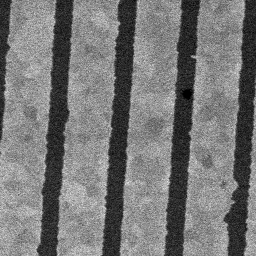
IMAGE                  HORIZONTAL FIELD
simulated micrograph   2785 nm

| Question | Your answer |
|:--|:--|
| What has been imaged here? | one or a few lines or trenches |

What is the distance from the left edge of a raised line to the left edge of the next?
683 nm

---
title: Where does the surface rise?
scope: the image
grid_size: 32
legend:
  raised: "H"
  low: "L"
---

LHHHHHHLLHHHHHHLLHHHHHHLLHHHHHHL
LHHHHHHLLHHHHHHLLHHHHHHLLHHHHHLL
LHHHHHHLLHHHHHHLLHHHHHLLLHHHHHLL
LHHHHHHLLHHHHHHLLHHHHHLLLHHHHHLL
LHHHHHHLLHHHHHHLLHHHHHLLLHHHHHLL
LHHHHHHLLHHHHHLLLHHHHHLLLHHHHHLL
LHHHHHLLLHHHHHLLLHHHHHLLLHHHHHLL
LHHHHHLLLHHHHHLLLHHHHHLLHHHHHHLL
LHHHHHLLLHHHHHLLLHHHHHLLLHHHHHLL
LHHHHHLLLHHHHHLLLHHHHHLLHHHHHHLL
LHHHHHLLLHHHHHLLLHHHHHLLHHHHHHLL
LHHHHHLLLHHHHHLLHHHHHHLLHHHHHHLL
LHHHHHLLLHHHHHLLHHHHHHLLHHHHHHLL
LHHHHHLLLHHHHHLLHHHHHHLLHHHHHHLL
LHHHHHLLLHHHHHLLHHHHHHLLHHHHHHLL
HHHHHHLLHHHHHHLLHHHHHHLLHHHHHLLL
HHHHHHLLHHHHHHLLHHHHHHLLHHHHHLLL
HHHHHHLLHHHHHHLLHHHHHLLLHHHHHLLL
HHHHHHLLHHHHHHLLHHHHHLLLHHHHHLLL
HHHHHHLLHHHHHLLLHHHHHLLLHHHHHLLH
HHHHHHLLHHHHHLLLHHHHHLLLHHHHHLLH
HHHHHHLLHHHHHLLLHHHHHLLLHHHHHLLH
HHHHHLLLHHHHHLLLHHHHHLLLHHHHHLLH
HHHHHLLLHHHHHLLLHHHHHLLHHHHHHLLH
HHHHHLLLHHHHHLLHHHHHHLLHHHHHHLLH
HHHHHLLLHHHHHLLHHHHHHLLHHHHHHLLH
HHHHHLLHHHHHHLLLHHHHHLLHHHHHLLLH
HHHHHLLHHHHHHLLHHHHHHLLHHHHHLLLH
HHHHHLLHHHHHHLLHHHHHHLLHHHHHLLLH
HHHHHLLHHHHHHLLHHHHHHLLHHHHHLLLH
HHHHHLLHHHHHHLLHHHHHHLLHHHHHLLLH
HHHHHLLHHHHHHLLHHHHHLLLHHHHHLLLH